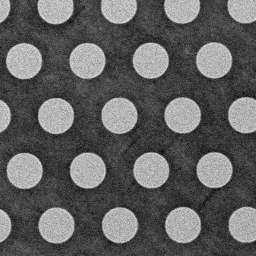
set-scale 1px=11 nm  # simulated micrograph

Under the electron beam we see an array of small figures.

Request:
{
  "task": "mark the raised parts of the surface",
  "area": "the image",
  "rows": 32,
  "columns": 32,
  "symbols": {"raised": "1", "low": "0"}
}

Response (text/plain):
10000111100001111000011110000111
10000111100001111000011110000111
00000011000000110000001100000111
00000000000000000000000000000000
00000000000000000000000000000000
00000000001000000011000000110000
01111000011110000111100001111000
01111000011110000111100001111000
01111000011110000111100001111000
00110000001100000011000000110000
00000000000000000000000000000000
00000000000000000000000000000000
00000011000000110000001100000011
10000111100001111000011110000111
10000111100001111000011110000111
10000111100001111000011110000111
00000011000000110000001100000010
00000000000000000000000000000000
00000000000000000000000000000000
00110000001100000011000000110000
01111000011110000111100001111000
01111000011110000111100001111000
01111000011110000111100001111000
00110000000000000000000000000000
00000000000000000000000000000000
00000000000000000000000000000000
00000011000000110000011100000111
10000111100001111000011110000111
10000111100001111000011110000111
10000111100001111000011110000111
00000000000000000000000000000000
00000000000000000000000000000000